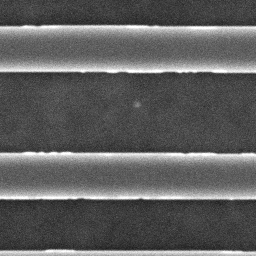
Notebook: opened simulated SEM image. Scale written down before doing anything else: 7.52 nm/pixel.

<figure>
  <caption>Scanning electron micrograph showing lines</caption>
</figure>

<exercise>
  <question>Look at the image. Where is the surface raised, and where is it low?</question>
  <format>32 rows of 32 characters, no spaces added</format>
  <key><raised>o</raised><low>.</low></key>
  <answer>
................................
................................
................................
oooooooooooooooooooooooooooooooo
oooooooooooooooooooooooooooooooo
oooooooooooooooooooooooooooooooo
oooooooooooooooooooooooooooooooo
oooooooooooooooooooooooooooooooo
oooooooooooooooooooooooooooooooo
................................
................................
................................
................................
................................
................................
................................
................................
................................
................................
oooooooooooooooooooooooooooooooo
oooooooooooooooooooooooooooooooo
oooooooooooooooooooooooooooooooo
oooooooooooooooooooooooooooooooo
oooooooooooooooooooooooooooooooo
oooooooooooooooooooooooooooooooo
................................
................................
................................
................................
................................
................................
oooooooooooooooooooooooooooooo..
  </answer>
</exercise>